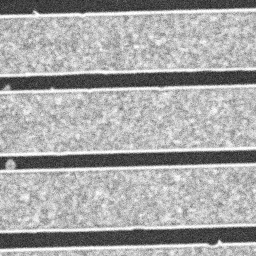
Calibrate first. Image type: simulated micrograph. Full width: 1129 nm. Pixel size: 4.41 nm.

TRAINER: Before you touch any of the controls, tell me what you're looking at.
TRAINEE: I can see one or a few lines or trenches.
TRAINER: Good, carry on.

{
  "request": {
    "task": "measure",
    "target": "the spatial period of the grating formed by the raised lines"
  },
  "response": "343 nanometers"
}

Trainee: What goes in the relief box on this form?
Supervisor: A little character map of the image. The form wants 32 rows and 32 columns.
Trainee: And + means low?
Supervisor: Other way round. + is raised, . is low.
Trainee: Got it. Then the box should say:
................................
.......................+++++++++
++++++++++++++++++++++++++++++++
++++++++++++++++++++++++++++++++
++++++++++++++++++++++++++++++++
++++++++++++++++++++++++++++++++
++++++++++++++++++++++++++++++++
++++++++++++++++++++++++++++++++
++++++++++++++++++++++++++++++++
................................
................................
...+++++++++++++++++++++++++++++
++++++++++++++++++++++++++++++++
++++++++++++++++++++++++++++++++
++++++++++++++++++++++++++++++++
++++++++++++++++++++++++++++++++
++++++++++++++++++++++++++++++++
++++++++++++++++++++++++++++++++
++++++++++++++++++++++++++++++++
................................
................................
++++++++++++++++++++++++++++++++
++++++++++++++++++++++++++++++++
++++++++++++++++++++++++++++++++
++++++++++++++++++++++++++++++++
++++++++++++++++++++++++++++++++
++++++++++++++++++++++++++++++++
++++++++++++++++++++++++++++++++
+++++++++++++++++...............
................................
................................
++++++++++++++++++++++++++++++++